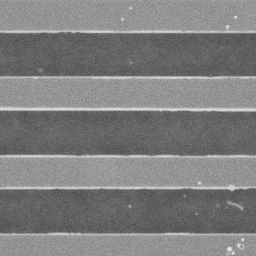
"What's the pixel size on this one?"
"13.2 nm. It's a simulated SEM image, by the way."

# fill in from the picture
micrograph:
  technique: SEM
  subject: lines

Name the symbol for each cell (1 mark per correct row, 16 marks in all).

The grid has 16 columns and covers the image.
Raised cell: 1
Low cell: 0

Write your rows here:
1111111111111111
1111111111111111
0000000000000000
0000000000000000
0000000000000000
1111111111111111
1111111111111111
0000000000000000
0000000000000000
0000000000000000
1111111111111111
1111111111111111
0000000000000000
0000000000000000
0000000000000000
1111111111111111